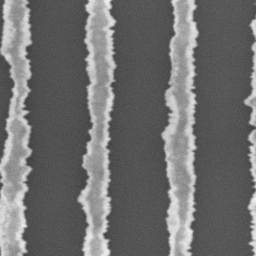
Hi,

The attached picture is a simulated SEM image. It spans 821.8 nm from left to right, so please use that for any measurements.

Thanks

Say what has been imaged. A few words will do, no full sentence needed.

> one or a few lines or trenches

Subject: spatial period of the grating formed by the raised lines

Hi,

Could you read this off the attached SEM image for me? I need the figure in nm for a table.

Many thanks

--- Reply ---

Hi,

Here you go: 266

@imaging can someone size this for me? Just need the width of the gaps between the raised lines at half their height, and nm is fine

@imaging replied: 202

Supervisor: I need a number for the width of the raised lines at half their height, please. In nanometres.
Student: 63.6